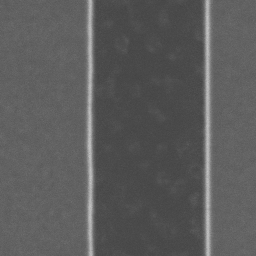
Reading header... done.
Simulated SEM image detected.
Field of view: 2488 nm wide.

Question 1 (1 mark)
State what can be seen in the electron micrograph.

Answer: one or a few lines or trenches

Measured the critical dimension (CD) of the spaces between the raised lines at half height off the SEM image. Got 1140 nanometres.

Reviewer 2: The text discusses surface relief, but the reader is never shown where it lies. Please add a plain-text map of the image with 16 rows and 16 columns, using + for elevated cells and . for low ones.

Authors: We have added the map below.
++++++.......+++
++++++.......+++
++++++.......+++
++++++.......+++
++++++.......+++
++++++.......+++
++++++.......+++
++++++.......+++
++++++.......+++
++++++.......+++
++++++.......+++
++++++.......+++
++++++.......+++
++++++.......+++
++++++.......+++
++++++.......+++